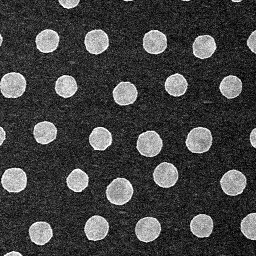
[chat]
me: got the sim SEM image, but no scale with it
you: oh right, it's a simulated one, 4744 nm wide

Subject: a regular array of raised bodies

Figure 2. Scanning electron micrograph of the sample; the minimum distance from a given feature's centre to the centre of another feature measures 48.2 px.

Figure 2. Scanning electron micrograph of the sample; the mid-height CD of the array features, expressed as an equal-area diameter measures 437 nanometers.